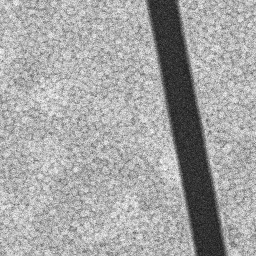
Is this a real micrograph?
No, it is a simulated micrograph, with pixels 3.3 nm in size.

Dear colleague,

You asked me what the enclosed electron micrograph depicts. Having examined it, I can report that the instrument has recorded one or a few lines or trenches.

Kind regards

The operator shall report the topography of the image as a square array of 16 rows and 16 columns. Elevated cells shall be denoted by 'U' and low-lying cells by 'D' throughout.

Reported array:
UUUUUUUUUDDUUUUU
UUUUUUUUUDDUUUUU
UUUUUUUUUUDDUUUU
UUUUUUUUUUDDUUUU
UUUUUUUUUUDDUUUU
UUUUUUUUUUDDUUUU
UUUUUUUUUUDDUUUU
UUUUUUUUUUUDDUUU
UUUUUUUUUUUDDUUU
UUUUUUUUUUUDDUUU
UUUUUUUUUUUDDUUU
UUUUUUUUUUUDDUUU
UUUUUUUUUUUUDDUU
UUUUUUUUUUUUDDUU
UUUUUUUUUUUUDDUU
UUUUUUUUUUUUDDUU